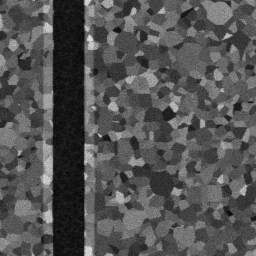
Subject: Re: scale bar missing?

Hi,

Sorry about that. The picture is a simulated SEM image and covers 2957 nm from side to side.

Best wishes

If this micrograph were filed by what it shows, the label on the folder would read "one or a few lines or trenches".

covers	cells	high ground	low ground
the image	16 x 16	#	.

###...##########
###...##########
###...##########
###...##########
###...##########
###...##########
###...##########
###...##########
###...##########
###...##########
###...##########
###...##########
###...##########
###...##########
###...##########
###...##########